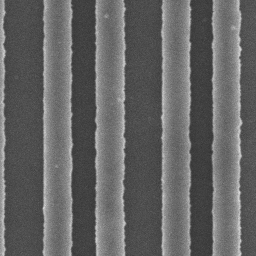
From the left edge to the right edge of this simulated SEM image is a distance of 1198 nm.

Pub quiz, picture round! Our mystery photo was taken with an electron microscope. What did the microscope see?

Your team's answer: lines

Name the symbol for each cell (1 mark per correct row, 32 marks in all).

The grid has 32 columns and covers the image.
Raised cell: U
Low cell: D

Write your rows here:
UDDDDDUUUDDDUUUDDDDDUUUUDDDUUUDD
UDDDDDUUUDDDUUUUDDDDUUUUDDDUUUDD
DDDDDDUUUDDDUUUUDDDDUUUUDDDUUUDD
DDDDDDUUUDDDUUUUDDDDUUUUDDDUUUDD
UDDDDDUUUDDDUUUUDDDDUUUUDDDUUUDD
UDDDDDUUUDDDUUUUDDDDUUUUDDDUUUDD
UDDDDUUUUDDDUUUUDDDDUUUUDDDUUUDD
UDDDDDUUUDDDUUUUDDDDUUUUDDDUUUDD
UDDDDDUUUDDDUUUUDDDDUUUUDDDUUUDD
UDDDDDUUUDDDUUUUDDDDUUUUDDDUUUDD
UDDDDDUUUDDDUUUUDDDDUUUUDDDUUUDD
DDDDDDUUUDDDUUUUDDDDUUUUDDDUUUDD
DDDDDUUUUDDDUUUUDDDDUUUUDDDUUUDD
UDDDDDUUUDDDUUUUDDDDUUUUDDDUUUDD
UDDDDUUUUDDDUUUUDDDDUUUUDDDUUUDD
UDDDDDUUUDDDUUUUDDDDUUUUDDDUUUDD
UDDDDDUUUDDDUUUDDDDDUUUUDDDUUUDD
UDDDDDUUUDDDUUUUDDDDUUUUDDDUUUDD
UDDDDDUUUDDDUUUUDDDDUUUUDDDUUUDD
UDDDDDUUUDDDUUUUDDDDUUUUDDDUUUDD
DDDDDDUUUDDDUUUUDDDDUUUUDDDUUUDD
UDDDDDUUUDDDUUUUDDDDUUUUDDDUUUDD
UDDDDDUUUDDDUUUDDDDDUUUUDDDUUUDD
UDDDDDUUUDDDUUUDDDDDUUUUDDDUUUDD
UDDDDDUUUDDDUUUDDDDDUUUUDDDUUUDD
UDDDDDUUUDDDUUUDDDDDUUUUDDDUUUDD
UDDDDUUUUDDDUUUDDDDDUUUUDDDUUUDD
UDDDDDUUUDDDUUUUDDDDUUUUDDDUUUDD
UDDDDDUUUDDDUUUUDDDDUUUUDDDUUUDD
UDDDDDUUUDDDUUUUDDDDUUUUDDDUUUDD
UDDDDDUUUDDDUUUUDDDDUUUUDDDUUUDD
UDDDDUUUUDDDUUUUDDDDUUUUDDDUUUDD